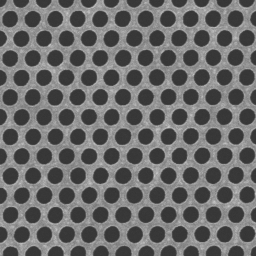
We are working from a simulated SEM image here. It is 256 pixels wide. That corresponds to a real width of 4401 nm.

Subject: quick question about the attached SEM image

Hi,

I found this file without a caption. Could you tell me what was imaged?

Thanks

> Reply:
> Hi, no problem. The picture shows a regular array of holes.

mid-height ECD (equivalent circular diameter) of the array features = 0.282 micrometres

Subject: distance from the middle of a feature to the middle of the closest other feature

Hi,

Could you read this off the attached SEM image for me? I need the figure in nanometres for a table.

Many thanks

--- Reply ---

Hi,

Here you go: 383